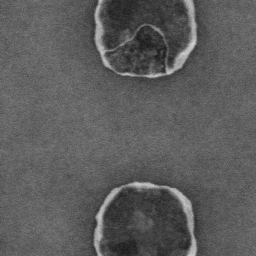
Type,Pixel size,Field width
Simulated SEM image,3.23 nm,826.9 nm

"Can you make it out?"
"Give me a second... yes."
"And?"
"raised bodies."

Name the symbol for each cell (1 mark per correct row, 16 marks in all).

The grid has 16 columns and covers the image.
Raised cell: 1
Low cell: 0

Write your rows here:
0000001111110000
0000001111110000
0000001100110000
0000000000110000
0000000000000000
0000000000000000
0000000000000000
0000000000000000
0000000000000000
0000000000000000
0000000000000000
0000000010000000
0000000111100000
0000001111110000
0000001111110000
0000001111110000